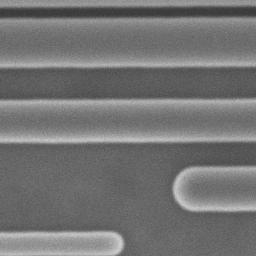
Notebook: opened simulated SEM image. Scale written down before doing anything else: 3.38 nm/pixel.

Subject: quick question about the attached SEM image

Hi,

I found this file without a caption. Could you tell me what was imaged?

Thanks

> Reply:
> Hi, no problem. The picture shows groups of lines, slits or small figures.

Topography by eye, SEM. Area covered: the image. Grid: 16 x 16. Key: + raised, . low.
................
++++++++++++++++
++++++++++++++++
++++++++++++++++
................
................
++++++++++++++++
++++++++++++++++
++++++++++++++++
................
............++++
...........+++++
...........+++++
................
................
++++++++........